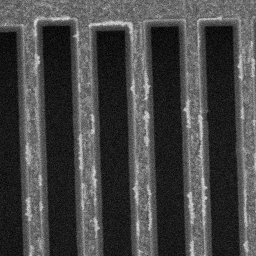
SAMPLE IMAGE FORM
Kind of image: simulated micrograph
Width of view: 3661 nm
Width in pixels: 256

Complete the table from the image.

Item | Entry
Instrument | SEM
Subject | parallel lines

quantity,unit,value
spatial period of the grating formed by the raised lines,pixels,54.1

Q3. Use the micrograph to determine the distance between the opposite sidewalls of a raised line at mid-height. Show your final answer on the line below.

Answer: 264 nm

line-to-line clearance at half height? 515 nm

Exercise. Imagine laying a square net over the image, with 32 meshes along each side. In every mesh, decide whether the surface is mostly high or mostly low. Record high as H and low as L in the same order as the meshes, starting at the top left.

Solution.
HHHHHHHHHHHHHHHHHHHHHHHHHHHHHHHH
HHHHHHHHHHHHHHHHHHHHHHHHHHHHHHHH
HHHHHHHHHHHHHHHHHHHHHHHHHHHHHHHH
LLHHHLLLLHHHLLLLHHLLLLLHHLLLLLHH
LLLHHLLLLHHHLLLLHHLLLLLHHLLLLLHH
LLLHHLLLLHHHLLLLHHLLLLLHHLLLLLHH
LLLHHLLLLHHHLLLLHHLLLLLHHLLLLLHH
LLLHHLLLLHHHLLLLHHLLLLLHHLLLLLHH
LLLHHLLLLHHHLLLLHHLLLLLHHLLLLLHH
LLLHHLLLLHHHLLLLHHLLLLLHHLLLLLHH
LLLHHLLLLHHHLLLLHHHLLLLHHLLLLLHH
LLLHHLLLLLHHLLLLHHHLLLLHHLLLLLHH
LLLHHLLLLLHHLLLLHHHLLLLHHLLLLLHH
LLLHHLLLLLHHLLLLLHHLLLLHHLLLLLHH
LLLHHLLLLLHHLLLLLHHLLLLHHLLLLLHH
LLLHHLLLLLHHLLLLLHHLLLLHHLLLLLHH
LLLHHLLLLLHHLLLLLHHLLLLHHHLLLLHH
LLLHHLLLLLHHLLLLLHHLLLLHHHLLLLHH
LLLHHLLLLLHHLLLLLHHLLLLHHHLLLLHH
LLLHHLLLLLHHLLLLLHHLLLLHHHLLLLHH
LLLHHLLLLLHHLLLLLHHLLLLHHHLLLLHH
LLLHHLLLLLHHLLLLLHHLLLLHHHLLLLHH
LLLHHLLLLLHHLLLLLHHLLLLLHHLLLLHH
LLLHHLLLLLHHLLLLLHHLLLLLHHLLLLHH
LLLHHLLLLLHHLLLLLHHLLLLHHHLLLLHH
LLLHHLLLLLHHLLLLLHHLLLLLHHLLLLHH
LLLHHHLLLLHHLLLLLHHLLLLLHHLLLLHH
LLLHHHLLLLHHLLLLLHHLLLLLHHLLLLHH
LLLHHHLLLLHHLLLLLHHLLLLLHHLLLLHH
LLLHHHLLLLHHLLLLLHHLLLLLHHLLLLHH
LLLHHHLLLLHHLLLLLHHLLLLLHHLLLLHH
LLLHHHLLLLHHLLLLLHHLLLLLHHLLLLHH